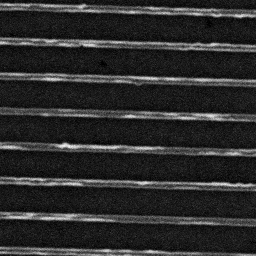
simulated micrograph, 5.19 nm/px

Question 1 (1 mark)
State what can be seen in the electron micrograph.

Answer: parallel lines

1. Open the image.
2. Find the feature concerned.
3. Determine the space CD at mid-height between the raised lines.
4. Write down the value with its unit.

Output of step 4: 149 nm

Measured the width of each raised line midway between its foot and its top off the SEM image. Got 32.4 nm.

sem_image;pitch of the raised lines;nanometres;181